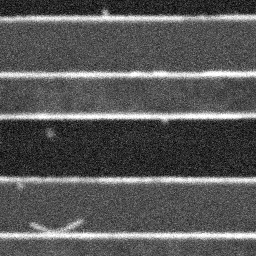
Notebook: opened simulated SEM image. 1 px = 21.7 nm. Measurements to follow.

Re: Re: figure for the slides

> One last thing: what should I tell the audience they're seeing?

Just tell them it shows lines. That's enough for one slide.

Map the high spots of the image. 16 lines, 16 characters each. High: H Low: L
LLLLLLLLLLLLLLLL
HHHHHHHHHHHHHHHH
HHHHHHHHHHHHHHHH
HHHHHHHHHHHHHHHH
HHHHHHHHHHHHHHHH
HHHHHHHHHHHHHHHH
HHHHHHHHHHHHHHHH
LLLLLLLLLLLLLLLL
LLLLLLLLLLLLLLLL
LLLLLLLLLLLLLLLL
LLLLLLLLLLLLLLLL
HHHHHHHHHHHHHHHH
HHHHHHHHHHHHHHHH
HHHHHHHHHHHHHHHH
HHHHHHHHHHHHHHHH
HHHHHHHHHHHHHHHH